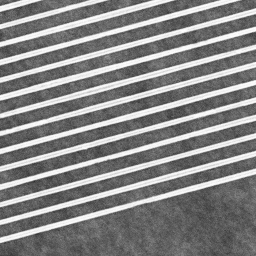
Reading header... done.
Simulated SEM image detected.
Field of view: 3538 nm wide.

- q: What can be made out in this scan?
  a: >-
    parallel lines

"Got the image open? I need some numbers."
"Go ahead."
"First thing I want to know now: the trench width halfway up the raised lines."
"193 nm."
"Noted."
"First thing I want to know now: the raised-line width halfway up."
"48.4 nanometers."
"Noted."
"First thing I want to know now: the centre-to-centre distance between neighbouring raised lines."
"238 nm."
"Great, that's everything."